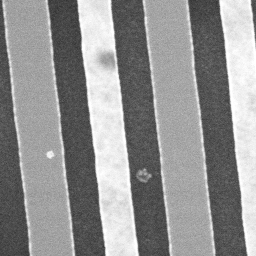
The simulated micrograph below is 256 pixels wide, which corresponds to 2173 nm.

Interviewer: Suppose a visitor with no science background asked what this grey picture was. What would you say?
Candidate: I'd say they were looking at lines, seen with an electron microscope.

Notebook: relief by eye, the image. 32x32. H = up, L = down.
HHHHHHLLLLHHHHLLLLHHHHHHLLLLHHHL
LHHHHHLLLLHHHHLLLLHHHHHHLLLLHHHL
LHHHHHLLLLHHHHLLLLHHHHHHLLLLHHHH
LHHHHHLLLLHHHHLLLLHHHHHHLLLLHHHH
LHHHHHLLLLHHHHLLLLHHHHHHLLLLHHHH
LHHHHHLLLLHHHHLLLLHHHHHHLLLLHHHH
LHHHHHHLLLHHHHLLLLLHHHHHLLLLHHHH
LHHHHHHLLLHHHHHLLLLHHHHHLLLLHHHH
LHHHHHHLLLLHHHHLLLLHHHHHLLLLHHHH
LHHHHHHLLLLHHHHLLLLHHHHHLLLLLHHH
LHHHHHHLLLLHHHHLLLLHHHHHHLLLLHHH
LLHHHHHLLLLHHHHLLLLHHHHHHLLLLHHH
LLHHHHHLLLLHHHHLLLLHHHHHHLLLLHHH
LLHHHHHLLLLHHHHLLLLHHHHHHLLLLHHH
LLHHHHHLLLLHHHHLLLLHHHHHHLLLLHHH
LLHHHHHHLLLHHHHLLLLLHHHHHLLLLHHH
LLHHHHHHLLLLHHHHLLLLHHHHHLLLLHHH
LLHHHHHHLLLLHHHHLLLLHHHHHLLLLHHH
LLHHHHHHLLLLHHHHLLLLHHHHHLLLLHHH
LLHHHHHHLLLLHHHHLLLLHHHHHHLLLLHH
LLLHHHHHLLLLHHHHLLLLHHHHHHLLLLHH
LLLHHHHHLLLLHHHHLLLLHHHHHHLLLLHH
LLLHHHHHLLLLHHHHLLLLHHHHHHLLLLHH
LLLHHHHHLLLLHHHHLLLLHHHHHHLLLLHH
LLLHHHHHLLLLHHHHLLLLLHHHHHLLLLHH
LLLHHHHHHLLLHHHHHLLLLHHHHHLLLLHH
LLLHHHHHHLLLLHHHHLLLLHHHHHLLLLHH
LLLHHHHHHLLLLHHHHLLLLHHHHHLLLLHH
LLLHHHHHHLLLLHHHHLLLLHHHHHHLLLHH
LLLLHHHHHLLLLHHHHLLLLHHHHHHLLLLH
LLLLHHHHHLLLLHHHHLLLLHHHHHHLLLLH
LLLLHHHHHLLLLHHHHLLLLHHHHHHLLLLH